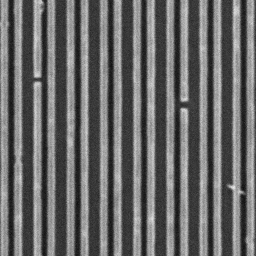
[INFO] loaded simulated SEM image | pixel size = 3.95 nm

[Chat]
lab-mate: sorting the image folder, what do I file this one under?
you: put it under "parallel lines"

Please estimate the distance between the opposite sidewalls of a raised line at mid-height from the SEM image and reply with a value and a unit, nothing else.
22.7 nm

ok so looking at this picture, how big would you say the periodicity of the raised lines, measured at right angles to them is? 0.0646 µm